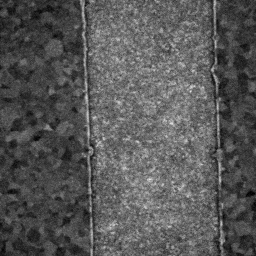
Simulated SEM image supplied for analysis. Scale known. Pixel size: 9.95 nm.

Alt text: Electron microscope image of one or a few lines or trenches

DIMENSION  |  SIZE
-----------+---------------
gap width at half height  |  1290 nm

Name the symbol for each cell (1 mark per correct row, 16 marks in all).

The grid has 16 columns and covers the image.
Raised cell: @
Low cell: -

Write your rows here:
@@@@@--------@@@
@@@@@--------@@@
@@@@@--------@@@
@@@@@--------@@@
@@@@@--------@@@
@@@@@---------@@
@@@@@---------@@
@@@@@@--------@@
@@@@@@--------@@
@@@@@@--------@@
@@@@@@--------@@
@@@@@@--------@@
@@@@@@--------@@
@@@@@@--------@@
@@@@@@--------@@
@@@@@@--------@@